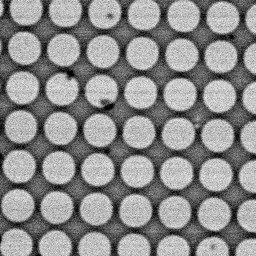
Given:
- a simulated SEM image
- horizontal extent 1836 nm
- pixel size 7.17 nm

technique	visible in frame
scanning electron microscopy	an array of small figures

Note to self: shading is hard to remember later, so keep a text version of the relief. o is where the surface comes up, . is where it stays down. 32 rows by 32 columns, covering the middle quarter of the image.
........ooo......ooooo....oooooo
............................ooo.
................................
oo.....oooo.......ooo...........
ooo...ooooooo...oooooo.....oooo.
ooo...ooooooo...ooooooo...oooooo
ooo...ooooooo..oooooooo..ooooooo
ooo...ooooooo..oooooooo..ooooooo
ooo...ooooooo..oooooooo..ooooooo
oo.....ooooo....oooooo....oooooo
........ooo......oooo.....oooooo
............................oo..
................................
oo....ooooo......ooo............
ooo...oooooo....oooooo....ooooo.
ooo..oooooooo..ooooooo...ooooooo
ooo..oooooooo..oooooooo..ooooooo
ooo..oooooooo..oooooooo..ooooooo
oo....oooooo...ooooooo...ooooooo
o.....oooooo....oooooo...ooooooo
........o........oooo.....ooooo.
................................
o...............................
oo....ooooo.....oooo.......o....
oo...ooooooo...oooooo....oooooo.
ooo..ooooooo...ooooooo...ooooooo
ooo..ooooooo..oooooooo..oooooooo
oo...ooooooo...ooooooo..oooooooo
oo...ooooooo...ooooooo..oooooooo
......ooooo....oooooo....oooooo.
.................ooo......ooooo.
................................